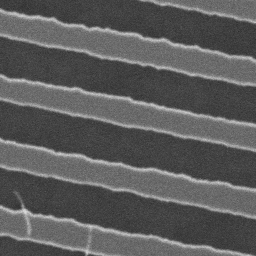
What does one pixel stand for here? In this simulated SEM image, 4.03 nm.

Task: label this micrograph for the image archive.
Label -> lines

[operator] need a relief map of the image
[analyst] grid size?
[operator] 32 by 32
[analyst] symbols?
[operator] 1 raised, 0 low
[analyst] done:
00000000000000000000111111111111
10000000000000000000000001111111
11111110000000000000000000000011
11111111111100000000000000000000
11111111111111111100000000000000
00001111111111111111110000000000
00000000001111111111111111100000
00000000000000111111111111111111
00000000000000000001111111111111
10000000000000000000000001111111
11111100000000000000000000000011
11111111111000000000000000000000
11111111111111111000000000000000
00000111111111111111100000000000
00000000001111111111111111000000
00000000000000111111111111111111
00000000000000000000111111111111
10000000000000000000000001111111
11111100000000000000000000000011
11111111111000000000000000000000
11111111111111100000000000000000
00011111111111111111100000000000
00000000111111111111111111000000
00000000000001111111111111111110
00000000000000000011111111111111
00000000000000000000000111111111
11110000000000000000000000011111
11111111100000000000000000000000
11111111111110000000000000000000
01111111111111111110000000000000
00000011111111111111111000000000
00000000001111111111111111111000